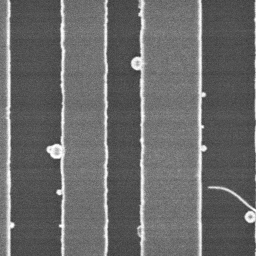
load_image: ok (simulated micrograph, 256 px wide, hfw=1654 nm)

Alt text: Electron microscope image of lines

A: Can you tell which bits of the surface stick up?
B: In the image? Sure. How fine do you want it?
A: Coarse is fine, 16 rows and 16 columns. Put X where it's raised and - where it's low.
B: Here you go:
X---XXX--XXXX---
X---XXX--XXXX---
X---XXX--XXXX---
X---XXX--XXXX---
X---XXX--XXXX---
X---XXX--XXXX---
X---XXX--XXXX---
X---XXX--XXXX---
X---XXX--XXXX---
X--XXXX--XXXX---
X---XXX--XXXX---
X---XXX--XXX----
X---XXX--XXXX---
X---XXX--XXX----
X---XXX--XXXX---
X---XXX--XXXX---